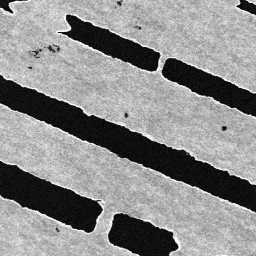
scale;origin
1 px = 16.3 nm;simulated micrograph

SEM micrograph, one or a few lines or trenches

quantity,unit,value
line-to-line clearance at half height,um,0.43